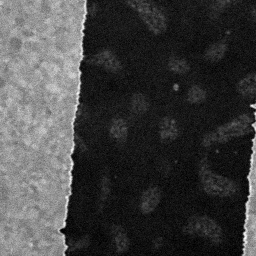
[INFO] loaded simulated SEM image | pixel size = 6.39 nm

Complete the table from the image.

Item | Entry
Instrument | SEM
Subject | one or a few lines or trenches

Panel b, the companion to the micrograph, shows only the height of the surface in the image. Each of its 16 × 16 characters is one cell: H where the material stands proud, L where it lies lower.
HHHHHLLLLLLLLLLL
HHHHHLLLLLLLLLLL
HHHHHLLLLLLLLLLL
HHHHHLLLLLLLLLLL
HHHHHLLLLLLLLLLL
HHHHHLLLLLLLLLLL
HHHHHLLLLLLLLLLL
HHHHHLLLLLLLLLLL
HHHHHLLLLLLLLLLL
HHHHHLLLLLLLLLLL
HHHHLLLLLLLLLLLL
HHHHLLLLLLLLLLLL
HHHHLLLLLLLLLLLH
HHHHLLLLLLLLLLLH
HHHHLLLLLLLLLLLH
HHHHLLLLLLLLLLLH